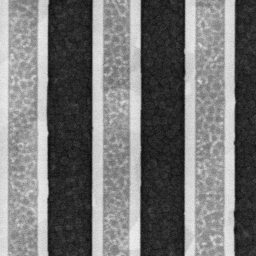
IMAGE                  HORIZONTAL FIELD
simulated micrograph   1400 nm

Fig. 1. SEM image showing one or a few lines or trenches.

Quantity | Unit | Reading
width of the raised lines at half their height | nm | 216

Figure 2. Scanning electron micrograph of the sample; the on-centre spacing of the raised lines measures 511 nm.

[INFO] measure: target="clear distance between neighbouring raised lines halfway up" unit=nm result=301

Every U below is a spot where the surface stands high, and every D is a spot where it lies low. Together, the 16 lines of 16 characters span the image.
UUUDDDUUDDDDUUDD
UUUDDDUUDDDDUUDD
UUUDDDUUDDDDUUDD
UUUDDDUUDDDDUUDD
UUUDDDUUDDDDUUDD
UUUDDDUUDDDDUUDD
UUUDDDUUDDDDUUDD
UUUDDDUUDDDDUUDD
UUUDDDUUDDDDUUDD
UUUDDDUUDDDDUUDD
UUUDDDUUDDDDUUDD
UUUDDDUUDDDDUUDD
UUUDDDUUDDDDUUDD
UUUDDDUUDDDDUUDD
UUUDDDUUDDDDUUDD
UUUDDDUUDDDDUUDD